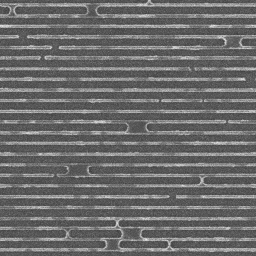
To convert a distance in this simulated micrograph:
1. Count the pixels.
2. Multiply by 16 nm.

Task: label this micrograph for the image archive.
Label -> parallel lines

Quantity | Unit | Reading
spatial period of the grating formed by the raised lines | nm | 170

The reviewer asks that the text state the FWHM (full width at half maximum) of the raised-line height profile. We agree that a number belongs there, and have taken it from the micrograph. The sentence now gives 39.9 nm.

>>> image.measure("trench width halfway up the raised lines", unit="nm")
132